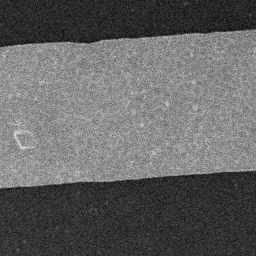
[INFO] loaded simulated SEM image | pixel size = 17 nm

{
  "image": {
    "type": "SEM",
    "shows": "one or a few lines or trenches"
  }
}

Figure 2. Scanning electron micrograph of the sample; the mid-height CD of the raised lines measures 2.38 µm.